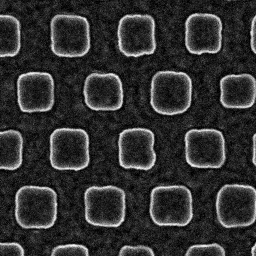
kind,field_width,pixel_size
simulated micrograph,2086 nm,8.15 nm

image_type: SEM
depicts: a regular array of raised bodies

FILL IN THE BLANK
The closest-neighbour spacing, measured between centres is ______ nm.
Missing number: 534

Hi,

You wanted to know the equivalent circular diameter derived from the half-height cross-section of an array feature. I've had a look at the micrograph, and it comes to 41.7 px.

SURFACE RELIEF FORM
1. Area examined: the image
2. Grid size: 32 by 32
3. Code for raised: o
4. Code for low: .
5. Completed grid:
................................
................................
oo.....oooo....oooo.....ooo.....
oo....ooooo....oooo....ooooo...o
oo....ooooo....oooo....ooooo...o
oo.....oooo....oooo....ooooo...o
oo.....oooo....oooo.....ooo.....
................................
................................
...ooo.....oooo....oooo......oo.
..ooooo....oooo....ooooo....oooo
..ooooo....oooo....ooooo....oooo
..ooooo....oooo....ooooo....oooo
...ooo......ooo....oooo.........
................................
................................
.o.....oooo....oooo.....ooo.....
ooo...ooooo....oooo....ooooo....
ooo...ooooo....oooo....ooooo....
ooo...ooooo....oooo....ooooo....
oo.....oooo....oooo.....oooo....
................................
................................
...ooo.....oooo.....ooo.....ooo.
..ooooo....ooooo...ooooo...ooooo
..ooooo....ooooo...ooooo...ooooo
..ooooo....oooo....ooooo...ooooo
..ooooo....oooo....ooooo...ooooo
................................
................................
oo..............................
ooo....oooo....oooo....ooooo....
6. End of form